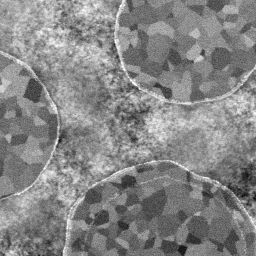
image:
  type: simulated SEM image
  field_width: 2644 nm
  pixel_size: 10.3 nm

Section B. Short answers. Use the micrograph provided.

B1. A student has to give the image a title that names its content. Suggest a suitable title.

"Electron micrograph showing raised bodies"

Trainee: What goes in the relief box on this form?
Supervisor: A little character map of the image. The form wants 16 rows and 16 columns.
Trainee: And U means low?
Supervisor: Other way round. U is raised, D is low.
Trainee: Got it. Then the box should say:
DDDDDDDDUUUUUUUU
DDDDDDDUUUUUUUUU
DDDDDDDUUUUUUUUU
UDDDDDDUUUUUUUUU
UUDDDDDDUUUUUUUU
UUUDDDDDDUUUUUUD
UUUDDDDDDDDDDDDD
UUUUDDDDDDDDDDDD
UUUUDDDDDDDDDDDD
UUUDDDDDDDDDDDDD
UUUDDDDDUUUUDDDD
UUDDDDUUUUUUUUDD
DDDDDUUUUUUUUUUD
DDDDUUUUUUUUUUUU
DDDDUUUUUUUUUUUU
DDDDUUUUUUUUUUUU